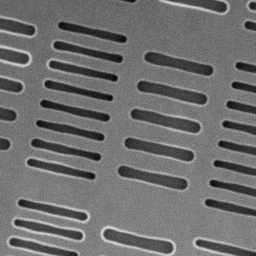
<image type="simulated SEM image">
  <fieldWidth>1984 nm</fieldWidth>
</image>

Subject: groups of lines, slits or small figures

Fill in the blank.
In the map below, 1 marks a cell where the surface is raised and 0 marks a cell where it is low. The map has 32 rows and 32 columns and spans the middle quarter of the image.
00000111111111111111111000000000
00000000111111111111111111111000
11100000000011111111111111111111
11111110000000111111111111111111
11111111111101111110000111111111
00011111111111111100000000011111
00000011111111111100000000000001
11100000000111111111110000000000
11111110000011111111111111000000
11111111111111111111111111111100
00111111111111111111111111111111
00000011111111111000111111111111
10000000000111111000000001111111
11111100000111111000000000000011
11111111111111111111100000000000
00111111111111111111111100000000
00000001111111111111111111100000
10000000001111111111111111111111
11111100001111110011111111111111
11111111111111100000001111111111
01111111111111100000000000001111
00000111111111111100000000000001
00000000011111111111110000000000
11111000011111111111111111100000
11111111111111111111111111111100
01111111111111001111111111111111
00001111111110000001111111111111
00000000111111000000000001111111
11110000111111100000000000000011
11111111111111111111100000000001
11111111111111111111111100000001
11111111111111111111111111110011